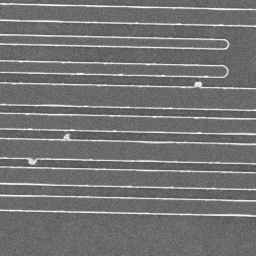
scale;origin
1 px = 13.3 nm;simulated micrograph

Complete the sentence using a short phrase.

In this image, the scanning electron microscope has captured groups of lines, slits or small figures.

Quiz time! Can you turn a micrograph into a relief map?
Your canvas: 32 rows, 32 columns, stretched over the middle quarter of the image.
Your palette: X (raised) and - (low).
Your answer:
XXXXXXXXXXXXXXXXXXXXXXXXXXXXXXXX
XXXXXXXXXXXXXXXXXXXXXXXXXXXXXXXX
---------XXXXXXXXXXXXXXXXXXXXXXX
--------------------------------
--------------------------------
XXXXXXXXXXXXXXX-----------------
XXXXXXXXXXXXXXXXXXXXXXXXXXXXXXXX
XXXXXXXXXXXXXXXXXXXXXXXXXXXXXXXX
XXXXXXXXXXXXXXXXXXXXXXXXXXXXXXXX
XXXXXXXXXXXXXXXXXXXXXXXXXXXXXXXX
-XXXXXXXXXXXXXXXXXXXXXXXXXXXXXXX
--------------------------------
--------------------------------
XXXXXXXXXXXXXXXXXXXXXXXXXXXXXXXX
XXXXXXXXXXXXXXXXXXXXXXXXXXXXXXXX
XXXXXXXXXXXXXXXXXXXXXXXXXXXXXXXX
XXXXXXXXXXXXXXXXXXXXXXXXXXXXXXXX
--------------------------------
X-------------------------------
XXXXXXXXXXXXXXXXXXXX------------
XXXXXXXXXXXXXXXXXXXXXXXXXXXXXXXX
XXXXXXXXXXXXXXXXXXXXXXXXXXXXXXXX
XXXXXXXXXXXXXXXXXXXXXXXXXXXXXXXX
XXXXXXXXXXXXXXXXXXXXXXXXXXXXXXXX
--------------------------------
--------------------------------
XXXXXXXXXXXXXX------------------
XXXXXXXXXXXXXXXXXXXXXXXXXXXXXXXX
XXXXXXXXXXXXXXXXXXXXXXXXXXXXXXXX
XXXXXXXXXXXXXXXXXXXXXXXXXXXXXXXX
----------XXXXXXXXXXXXXXXXXXXXXX
--------------------------------